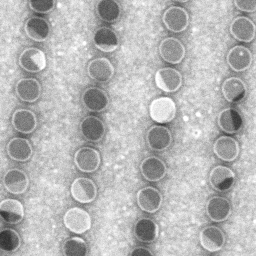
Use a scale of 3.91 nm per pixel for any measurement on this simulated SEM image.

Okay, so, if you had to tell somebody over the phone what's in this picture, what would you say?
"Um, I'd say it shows a regular array of raised bodies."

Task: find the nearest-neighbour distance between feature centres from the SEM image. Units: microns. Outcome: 0.117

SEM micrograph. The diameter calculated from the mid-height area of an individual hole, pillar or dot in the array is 96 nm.